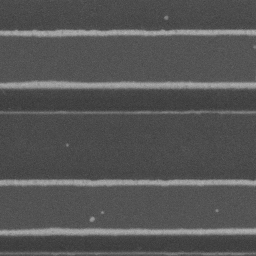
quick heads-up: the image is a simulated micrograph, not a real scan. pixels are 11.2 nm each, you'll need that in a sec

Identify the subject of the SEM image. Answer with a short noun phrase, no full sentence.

lines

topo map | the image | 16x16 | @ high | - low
----------------
----------------
@@@@@@@@@@@@@@@@
@@@@@@@@@@@@@@@@
@@@@@@@@@@@@@@@@
----------------
----------------
----------------
----------------
----------------
----------------
@@@@@@@@@@@@@@@@
@@@@@@@@@@@@@@@@
@@@@@@@@@@@@@@@@
@@@@@@@@@@@@@@@@
----------------